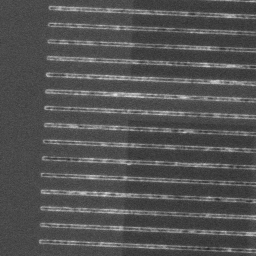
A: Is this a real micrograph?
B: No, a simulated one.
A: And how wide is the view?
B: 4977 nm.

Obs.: parallel lines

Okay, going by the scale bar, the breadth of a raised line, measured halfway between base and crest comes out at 65.5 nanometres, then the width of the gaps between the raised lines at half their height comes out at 0.262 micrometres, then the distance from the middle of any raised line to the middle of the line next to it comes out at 325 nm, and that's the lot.